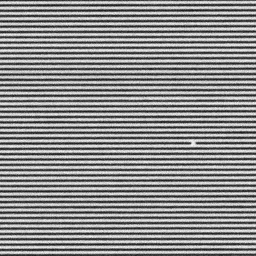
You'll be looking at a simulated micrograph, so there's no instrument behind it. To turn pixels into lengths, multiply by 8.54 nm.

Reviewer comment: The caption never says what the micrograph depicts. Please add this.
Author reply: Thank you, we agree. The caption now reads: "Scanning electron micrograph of parallel lines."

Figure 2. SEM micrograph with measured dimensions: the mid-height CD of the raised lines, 23.5 nanometers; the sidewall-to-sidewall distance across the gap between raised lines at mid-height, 2.62 px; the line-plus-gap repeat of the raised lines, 5.32 px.